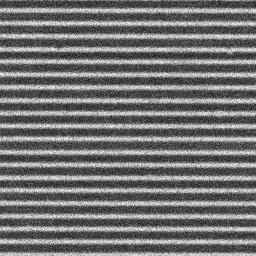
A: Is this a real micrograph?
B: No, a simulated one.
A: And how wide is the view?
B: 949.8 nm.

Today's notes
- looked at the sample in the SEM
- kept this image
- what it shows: parallel lines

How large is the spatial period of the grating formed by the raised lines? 47.7 nanometers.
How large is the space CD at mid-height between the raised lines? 27.4 nm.